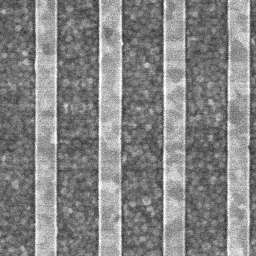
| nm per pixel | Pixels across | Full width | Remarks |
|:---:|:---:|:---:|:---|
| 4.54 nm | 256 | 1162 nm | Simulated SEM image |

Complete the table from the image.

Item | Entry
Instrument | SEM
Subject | one or a few lines or trenches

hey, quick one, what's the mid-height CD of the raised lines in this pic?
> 0.0954 µm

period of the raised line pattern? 0.292 um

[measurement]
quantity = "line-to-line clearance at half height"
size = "196 nanometres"